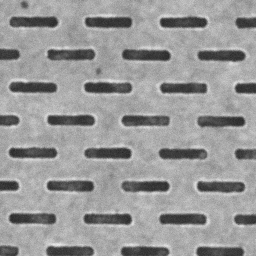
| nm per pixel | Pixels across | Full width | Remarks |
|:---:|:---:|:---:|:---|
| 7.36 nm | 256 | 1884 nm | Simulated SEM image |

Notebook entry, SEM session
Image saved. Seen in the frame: a regular array of holes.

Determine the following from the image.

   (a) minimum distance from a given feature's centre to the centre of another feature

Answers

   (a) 365 nanometers